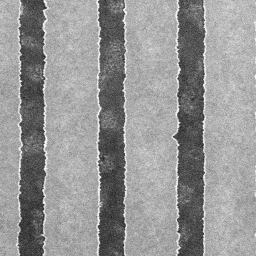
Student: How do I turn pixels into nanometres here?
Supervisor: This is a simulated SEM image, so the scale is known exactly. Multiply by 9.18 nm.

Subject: one or a few lines or trenches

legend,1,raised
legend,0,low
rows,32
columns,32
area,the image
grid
11100011111100001111110001111111
11000011111100001111110000111111
11000011111100001111110000111111
11000111111100001111110000111111
11000011111100001111110000111111
11100011111100001111110000111111
11100011111100001111110000111111
11000011111100001111110000111111
11100011111100001111110000111111
11000011111100001111110000111111
11100011111100001111110000111111
11000111111100001111110000111111
11000011111100001111110000111111
11000011111100001111110001111111
11100011111100001111110000111111
11000011111100001111110001111111
11100011111100001111110001111111
11100011111100001111110001111111
11100011111100001111110001111111
11100011111100001111110000111111
11000011111100001111110000111111
11000011111100001111110000111111
11000011111100001111110000111111
11000011111100001111110000111111
11000011111100001111110000111111
11000011111100001111110001111111
11000011111100001111110000111111
11100011111100001111110001111111
11000111111100001111110000111111
11000011111100001111110000111111
11000011111100001111110000111111
11000111111100001111110001111111